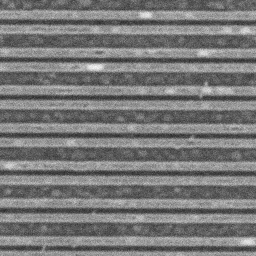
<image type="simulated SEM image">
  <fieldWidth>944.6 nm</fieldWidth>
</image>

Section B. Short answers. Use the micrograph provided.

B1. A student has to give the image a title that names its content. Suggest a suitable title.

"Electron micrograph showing parallel lines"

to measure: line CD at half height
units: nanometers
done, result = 31.3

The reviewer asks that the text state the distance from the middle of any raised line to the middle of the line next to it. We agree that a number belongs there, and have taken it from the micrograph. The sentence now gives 69.5 nanometers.